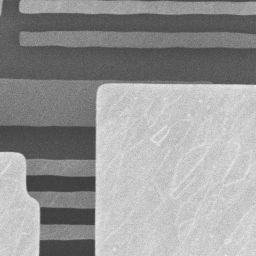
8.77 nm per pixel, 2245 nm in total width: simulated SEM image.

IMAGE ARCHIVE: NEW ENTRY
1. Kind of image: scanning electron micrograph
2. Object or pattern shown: wiring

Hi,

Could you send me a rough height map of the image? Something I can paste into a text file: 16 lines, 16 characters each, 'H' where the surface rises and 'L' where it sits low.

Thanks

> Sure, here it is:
LLLLLLLLLLLLLLLL
LLLLLLLLLLLLLLLL
LLLLLLLLLLLLLLLL
LLLLLLLLLLLLLLLL
LLLLLLLLLLLLLLLL
LLLLLLHHHHHHHHHH
LLLLLLHHHHHHHHHH
LLLLLLHHHHHHHHHH
LLLLLLHHHHHHHHHH
LLLLLLHHHHHHHHHH
HHLLLLHHHHHHHHHH
HHLLLLHHHHHHHHHH
HHLLLLHHHHHHHHHH
HHLLLLHHHHHHHHHH
HHLLLLHHHHHHHHHH
HHLLLLHHHHHHHHHH